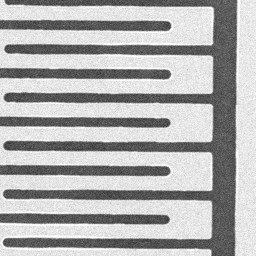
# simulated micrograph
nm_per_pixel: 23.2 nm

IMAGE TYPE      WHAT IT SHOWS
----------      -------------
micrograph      groups of lines, slits or small figures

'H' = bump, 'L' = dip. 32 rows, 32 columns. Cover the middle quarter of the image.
HHHHHHHHHHHHHHHHHHHHHHHHHHHHHHHH
LLLLLLLLLLLLLLLLLLLLLLLLLLHHHHHH
LLLLLLLLLLLLLLLLLLLLLLLLLLLHHHHH
LLLLLLLLLLLLLLLLLLLLLLLLLLLHHHHH
HHHHHHHHHHHHHHHHHHHHHHHHHHHHHHHH
HHHHHHHHHHHHHHHHHHHHHHHHHHHHHHHH
HHHHHHHHHHHHHHHHHHHHHHHHHHHHHHHH
LLLLLLLLLLLLLLLLLLLLLLLLLLLLLLLL
LLLLLLLLLLLLLLLLLLLLLLLLLLLLLLLL
LLLLLLLLLLLLLLLLLLLLLLLLLLLLLLLL
HHHHHHHHHHHHHHHHHHHHHHHHHHHHHHHH
HHHHHHHHHHHHHHHHHHHHHHHHHHHHHHHH
HHHHHHHHHHHHHHHHHHHHHHHHHHHHHHHH
LLLLLLLLLLLLLLLLLLLLLLLLLLHHHHHH
LLLLLLLLLLLLLLLLLLLLLLLLLLLHHHHH
LLLLLLLLLLLLLLLLLLLLLLLLLLHHHHHH
HHHHHHHHHHHHHHHHHHHHHHHHHHHHHHHH
HHHHHHHHHHHHHHHHHHHHHHHHHHHHHHHH
HHHHHHHHHHHHHHHHHHHHHHHHHHHHHHHH
LLLLLLLLLLLLLLLLLLLLLLLLLLLLLLLL
LLLLLLLLLLLLLLLLLLLLLLLLLLLLLLLL
LLLLLLLLLLLLLLLLLLLLLLLLLLLLLLLL
HHHHHHHHHHHHHHHHHHHHHHHHHHHHHHHH
HHHHHHHHHHHHHHHHHHHHHHHHHHHHHHHH
HHHHHHHHHHHHHHHHHHHHHHHHHHHHHHHH
LLLLLLLLLLLLLLLLLLLLLLLLLLHHHHHH
LLLLLLLLLLLLLLLLLLLLLLLLLLLHHHHH
LLLLLLLLLLLLLLLLLLLLLLLLLLLHHHHH
HHHHHHHHHHHHHHHHHHHHHHHHHHHHHHHH
HHHHHHHHHHHHHHHHHHHHHHHHHHHHHHHH
HHHHHHHHHHHHHHHHHHHHHHHHHHHHHHHH
LLLLLLLLLLLLLLLLLLLLLLLLLLLLLLLL